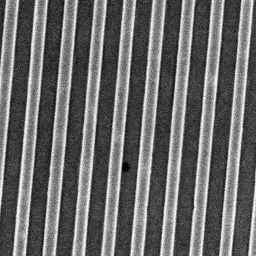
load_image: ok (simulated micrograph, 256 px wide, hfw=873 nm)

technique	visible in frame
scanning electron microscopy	parallel lines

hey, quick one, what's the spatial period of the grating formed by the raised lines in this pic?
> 99.8 nanometres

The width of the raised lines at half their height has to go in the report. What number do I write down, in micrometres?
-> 0.0395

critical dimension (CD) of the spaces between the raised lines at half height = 59.4 nm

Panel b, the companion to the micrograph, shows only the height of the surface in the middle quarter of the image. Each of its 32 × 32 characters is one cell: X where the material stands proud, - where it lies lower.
XX----XXX-----XX-----XXX----XXX-
XX----XXX-----XX-----XXX----XXX-
XX----XXX----XXX-----XXX----XXX-
XX----XXX----XXX-----XXX----XXX-
X-----XXX----XXX-----XXX----XXX-
X-----XXX----XXX----XXX-----XXX-
X-----XXX----XXX----XXX-----XXX-
X-----XX-----XXX----XXX-----XXX-
X-----XX-----XXX----XXX-----XX--
X-----XX-----XXX----XXX-----XX--
X----XXX-----XX-----XXX-----XX--
X----XXX-----XX-----XXX----XXX--
X----XXX-----XX-----XXX----XXX--
X----XXX----XXX-----XXX----XXX--
X----XXX----XXX-----XXX----XXX--
-----XXX----XXX-----XXX----XXX--
-----XXX----XXX-----XX-----XXX--
-----XXX----XXX----XXX-----XXX--
-----XXX----XXX----XXX-----XXX--
-----XX-----XXX----XXX-----XX---
-----XX-----XXX----XXX-----XX---
-----XX-----XXX----XXX-----XX---
----XXX-----XX-----XXX----XXX---
----XXX-----XX-----XXX----XXX---
----XXX-----XX-----XXX----XXX---
----XXX----XXX-----XXX----XXX---
----XXX----XXX-----XXX----XXX---
----XXX----XXX-----XXX----XXX---
----XXX----XXX----XXX-----XXX---
----XXX----XXX----XXX-----XXX---
----XX-----XXX----XXX-----XXX---
----XX-----XXX----XXX-----XX----